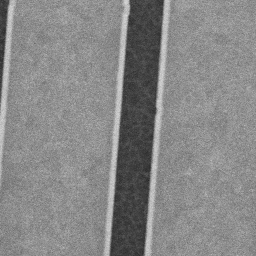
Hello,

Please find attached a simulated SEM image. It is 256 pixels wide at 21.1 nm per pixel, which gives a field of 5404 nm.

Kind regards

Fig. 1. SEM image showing one or a few lines or trenches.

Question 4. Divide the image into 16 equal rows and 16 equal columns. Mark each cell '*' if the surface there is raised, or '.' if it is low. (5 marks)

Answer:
.*******..******
.*******..******
.*******..******
********..******
********..******
*******...******
*******...******
*******...******
*******...******
*******...******
*******...******
*******...******
*******..*******
*******..*******
*******..*******
*******..*******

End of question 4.